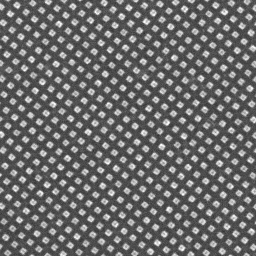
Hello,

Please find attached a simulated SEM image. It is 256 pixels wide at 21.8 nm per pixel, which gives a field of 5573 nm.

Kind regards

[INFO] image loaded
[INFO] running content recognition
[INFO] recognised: a regular array of raised bodies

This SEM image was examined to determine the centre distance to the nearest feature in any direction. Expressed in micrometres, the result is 0.236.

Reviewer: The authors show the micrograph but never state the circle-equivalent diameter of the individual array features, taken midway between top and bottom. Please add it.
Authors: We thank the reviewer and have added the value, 123 nm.